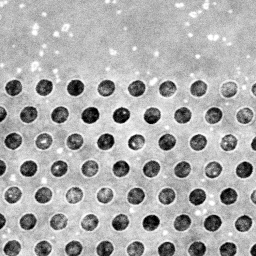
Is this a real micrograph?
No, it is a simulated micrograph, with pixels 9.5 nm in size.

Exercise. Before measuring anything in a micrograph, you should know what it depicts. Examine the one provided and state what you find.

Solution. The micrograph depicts a regular array of holes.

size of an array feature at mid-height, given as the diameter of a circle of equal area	18.2	px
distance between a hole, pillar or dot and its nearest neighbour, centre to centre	0.29	um